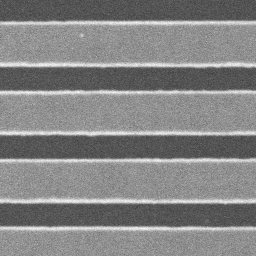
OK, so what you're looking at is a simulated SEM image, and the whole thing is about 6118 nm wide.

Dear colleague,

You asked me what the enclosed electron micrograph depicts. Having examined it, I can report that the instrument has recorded lines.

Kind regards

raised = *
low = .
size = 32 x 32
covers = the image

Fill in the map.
................................
................................
................................
********************************
********************************
********************************
********************************
********************************
................................
................................
................................
********************************
********************************
********************************
********************************
********************************
********************************
................................
................................
................................
********************************
********************************
********************************
********************************
********************************
................................
................................
................................
******.******.*******...*....*..
********************************
********************************
********************************